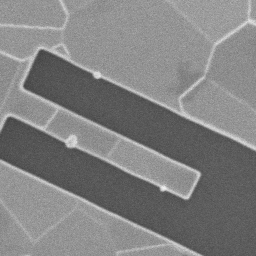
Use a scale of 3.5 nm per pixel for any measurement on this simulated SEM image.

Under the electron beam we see groups of lines, slits or small figures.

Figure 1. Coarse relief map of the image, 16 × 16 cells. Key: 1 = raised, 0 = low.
1111111111111111
1111111111111111
1111111111111111
1100111111111111
1100001111111111
1100000011111111
1110000000111111
0111100000001111
0001111100000011
0000011111000000
1000000011110000
1110000000110000
1111100000000000
1111111000000000
1111111110000000
1111111111110000